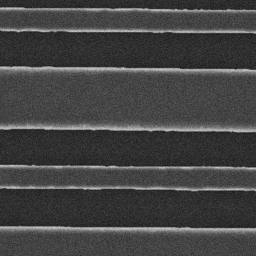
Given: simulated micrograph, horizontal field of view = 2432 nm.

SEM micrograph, lines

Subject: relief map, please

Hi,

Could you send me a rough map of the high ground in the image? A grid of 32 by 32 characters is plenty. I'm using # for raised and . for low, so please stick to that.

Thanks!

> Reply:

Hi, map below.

................................
################################
################################
################################
................................
................................
................................
................................
#############..#................
################################
################################
################################
################################
################################
################################
################################
................................
................................
................................
................................
................................
################################
################################
.###############################
................................
................................
................................
................................
######################..........
################################
################################
################################